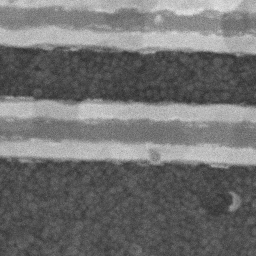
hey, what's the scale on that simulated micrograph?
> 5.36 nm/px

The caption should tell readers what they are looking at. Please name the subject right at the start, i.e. one or a few lines or trenches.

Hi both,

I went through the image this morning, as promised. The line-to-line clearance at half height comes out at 380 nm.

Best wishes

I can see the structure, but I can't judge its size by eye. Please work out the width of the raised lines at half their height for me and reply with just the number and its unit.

221 nm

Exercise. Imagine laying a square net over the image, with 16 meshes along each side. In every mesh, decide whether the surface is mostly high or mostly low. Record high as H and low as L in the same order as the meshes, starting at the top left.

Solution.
HHHHHHHHHHHHHHHH
HHHHHHHHHHHHHHHH
LLLLLLHHHLHHHHHH
LLLLLLLLLLLLLLLL
LLLLLLLLLLLLLLLL
LLLLLLLLLLLLLLLL
LLLLLLLLLLLLLLLL
HHHHHHHHHHHHHHHH
HHHHHHHHHHHHHHHH
LLLLLHLLLHHHHHHH
LLLLLLLLLLLLLLLL
LLLLLLLLLLLLLLLL
LLLLLLLLLLLLLLLL
LLLLLLLLLLLLLLLL
LLLLLLLLLLLLLLLL
LLLLLLLLLLLLLLLL